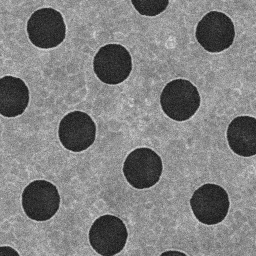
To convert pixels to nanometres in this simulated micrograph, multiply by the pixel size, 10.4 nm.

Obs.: a regular array of holes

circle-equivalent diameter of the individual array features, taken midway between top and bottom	0.425	um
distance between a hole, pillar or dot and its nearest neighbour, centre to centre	0.786	µm